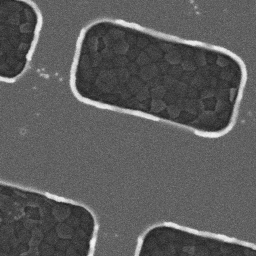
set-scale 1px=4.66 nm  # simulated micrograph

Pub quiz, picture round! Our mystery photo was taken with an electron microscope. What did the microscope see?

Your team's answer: holes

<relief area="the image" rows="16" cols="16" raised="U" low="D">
DDUUUUUUUUUUUUUU
DDUUUUDUUUUUUUUU
DDUUUDDDDDUUUUUU
DDUUUDDDDDDDDDUU
DUUUUDDDDDDDDDDU
UUUUUDDDDDDDDDDU
UUUUUUUDDDDDDDDU
UUUUUUUUUUDDDDUU
UUUUUUUUUUUUUUUU
UUUUUUUUUUUUUUUU
UUUUUUUUUUUUUUUU
UUUUUUUUUUUUUUUU
DDDUUUUUUUUUUUUU
DDDDDDUUUUUUUUUU
DDDDDDUUUDDDUUUU
DDDDDDUUUDDDDDDD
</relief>